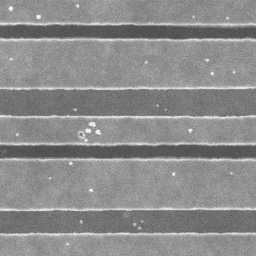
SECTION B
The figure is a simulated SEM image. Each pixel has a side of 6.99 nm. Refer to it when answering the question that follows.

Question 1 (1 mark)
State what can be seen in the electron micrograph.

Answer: lines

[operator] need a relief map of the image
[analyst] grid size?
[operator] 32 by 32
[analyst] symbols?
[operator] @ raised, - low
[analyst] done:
@@@@@@@@@@@@@@@@@@@@@@@@@@@@@@@@
@@@@@@@@@@@@@@@@@@@@@@@@@@@@@@@@
@@@@@@@@@@@@@@@@@@@@@@@@@@@@@@@@
--------------------------------
--------------------------------
@@@@@@@@@@@@@@@@@@@@@@@@@@@@@@@@
@@@@@@@@@@@@@@@@@@@@@@@@@@@@@@@@
@@@@@@@@@@@@@@@@@@@@@@@@@@@@@@@@
@@@@@@@@@@@@@@@@@@@@@@@@@@@@@@@@
@@@@@@@@@@@@@@@@@@@@@@@@@@@@@@@@
@@@@@@@@@@@@@@@@@@@@@@@@@@@@@@@@
--------------------------------
--------------------------------
--------------------------------
@-------------------------------
@@@@@@@@@@@@@@@@@@@@@@@@@@@@@@@@
@@@@@@@@@@@@@@@@@@@@@@@@@@@@@@@@
@@@@@@@@@@@@@@@@@@@@@@@@@@@@@@@@
--------------------------------
--------------------------------
@@@@@@@@@@@@@@@@@@@@@@@@@@@@@@@@
@@@@@@@@@@@@@@@@@@@@@@@@@@@@@@@@
@@@@@@@@@@@@@@@@@@@@@@@@@@@@@@@@
@@@@@@@@@@@@@@@@@@@@@@@@@@@@@@@@
@@@@@@@@@@@@@@@@@@@@@@@@@@@@@@@@
@@@@@@@@@@@@@@@@@@@@@@@@@@@@@@@@
--------------------------------
--------------------------------
--------------------------------
@@@@@@@@@@@@@@@@@@@@@@@@@@@@@@@@
@@@@@@@@@@@@@@@@@@@@@@@@@@@@@@@@
@@@@@@@@@@@@@@@@@@@@@@@@@@@@@@@@